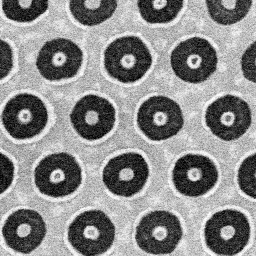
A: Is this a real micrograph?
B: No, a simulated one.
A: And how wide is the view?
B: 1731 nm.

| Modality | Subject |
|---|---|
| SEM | a regular array of ring-shaped grooves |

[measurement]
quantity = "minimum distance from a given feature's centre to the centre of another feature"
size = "451 nm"